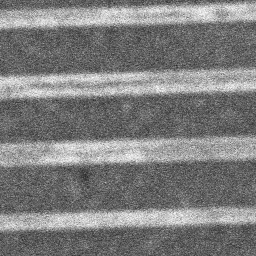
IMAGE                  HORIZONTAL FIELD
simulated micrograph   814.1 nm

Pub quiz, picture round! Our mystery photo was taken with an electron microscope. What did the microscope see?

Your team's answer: one or a few lines or trenches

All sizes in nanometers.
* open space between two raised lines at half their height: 161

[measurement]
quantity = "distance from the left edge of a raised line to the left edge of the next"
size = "215 nm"